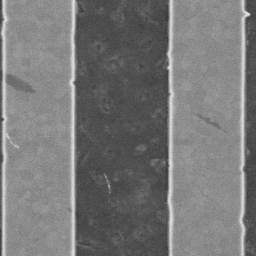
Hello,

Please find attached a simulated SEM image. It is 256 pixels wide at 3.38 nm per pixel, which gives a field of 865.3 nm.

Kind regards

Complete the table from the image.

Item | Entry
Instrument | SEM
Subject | one or a few lines or trenches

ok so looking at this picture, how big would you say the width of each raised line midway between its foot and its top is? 241 nanometres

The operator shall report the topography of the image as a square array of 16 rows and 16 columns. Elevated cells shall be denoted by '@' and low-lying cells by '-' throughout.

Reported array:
@@@@@------@@@@-
@@@@@------@@@@-
@@@@@------@@@@-
@@@@@------@@@@-
@@@@@------@@@@-
@@@@@------@@@@-
@@@@@------@@@@-
@@@@@------@@@@-
@@@@@------@@@@-
@@@@@------@@@@-
@@@@@------@@@@-
@@@@@------@@@@-
@@@@@------@@@@-
@@@@@------@@@@-
@@@@@------@@@@-
@@@@@------@@@@-